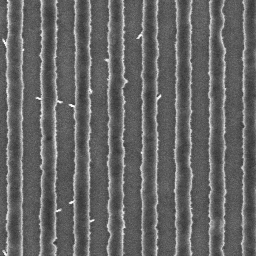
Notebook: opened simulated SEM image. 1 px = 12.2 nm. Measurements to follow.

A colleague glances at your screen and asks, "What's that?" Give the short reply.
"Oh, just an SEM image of parallel lines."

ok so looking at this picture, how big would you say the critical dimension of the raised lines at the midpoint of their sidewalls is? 188 nm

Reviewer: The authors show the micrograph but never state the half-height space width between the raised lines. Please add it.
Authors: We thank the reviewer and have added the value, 18.3 pixels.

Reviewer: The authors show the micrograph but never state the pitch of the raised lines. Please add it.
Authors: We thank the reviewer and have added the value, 411 nm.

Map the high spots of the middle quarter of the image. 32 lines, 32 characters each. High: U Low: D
DDDUUUUDDDDUUUUDDDDDUUUDDDDDUUUU
DDDUUUDDDDDUUUUDDDDDUUUDDDDDUUUU
DDDUUUDDDDDUUUUDDDDUUUUDDDDDUUUU
DDDUUUDDDDDUUUUDDDDDUUUDDDDDUUUU
DDDUUUDDDDDUUUUUDDDDUUUDDDDDUUUU
DDDUUUDDDDDUUUUDDDDDUUUDDDDDUUUU
DDDUUUUDDDDUUUUDDDDDUUUDDDDDUUUU
DDDUUUDDDDDUUUUDDDDDUUUDDDDDUUUU
DDDUUUDDDDDUUUUDDDDDUUUUDDDDUUUU
DDDUUUUDDDDUUUUDDDDDUUUDDDDDUUUU
DDUUUUUDDDDUUUUDDDDDUUUDDDDDUUUU
DDDUUUUDDDDUUUUDDDDDUUUDDDDDUUUU
DDDUUUUDDDDUUUUDDDDDUUUDDDDDUUUU
DDDUUUDDDDDUUUUDDDDDUUUDDDDDUUUU
DDDUUUDDDDDUUUUDDDDDUUUDDDDDUUUD
DDDUUUDDDDDUUUUDDDDDUUUDDDDDUUUU
DDDUUUDDDDDUUUUDDDDDUUUDDDDDUUUU
DDDUUUDDDDDUUUUDDDDDUUUDDDDDUUUU
DDDUUUDDDDDUUUUDDDDDUUUDDDDDUUUU
DDDUUUDDDDDUUUUDDDDDUUUDDDDDUUUU
DDDUUUDDDDDUUUUDDDDDUUUDDDDDUUUU
DDDUUUDDDDDUUUUDDDDDUUUDDDDDUUUU
DDDUUUDDDDDUUUUDDDDDUUUDDDDDUUUU
DDDUUUDDDDDUUUUDDDDDUUUDDDDDUUUD
DDDUUUDDDDDUUUUDDDDDUUUDDDDDUUUU
DDDUUUDDDDDUUUUDDDDUUUUDDDDDUUUU
DDDUUUDDDDDUUUUDDDDUUUUDDDDDUUUU
DDDUUUDDDDDUUUUDDDDDUUUDDDDDUUUU
DDDUUUDDDDDUUUUDDDDDUUUDDDDDUUUU
DDDUUUDDDDDUUUUDDDDDUUUDDDDDUUUU
DDDUUUDDDDDUUUUDDDDDUUUDDDDDUUUU
DDDUUUDDDDDUUUUDDDDUUUUDDDDDUUUU